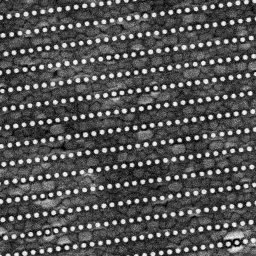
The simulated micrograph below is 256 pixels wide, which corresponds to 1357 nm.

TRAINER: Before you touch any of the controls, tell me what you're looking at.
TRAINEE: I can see a regular array of raised bodies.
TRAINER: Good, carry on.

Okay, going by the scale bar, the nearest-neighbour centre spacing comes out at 44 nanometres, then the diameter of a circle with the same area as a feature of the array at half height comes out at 0.0247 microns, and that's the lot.